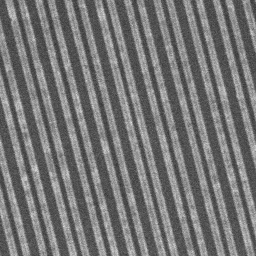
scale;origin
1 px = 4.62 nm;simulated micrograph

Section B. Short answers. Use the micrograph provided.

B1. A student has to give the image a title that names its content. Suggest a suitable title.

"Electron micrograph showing parallel lines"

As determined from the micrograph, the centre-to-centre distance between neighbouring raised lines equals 66.3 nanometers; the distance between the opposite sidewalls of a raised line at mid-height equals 0.0219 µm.